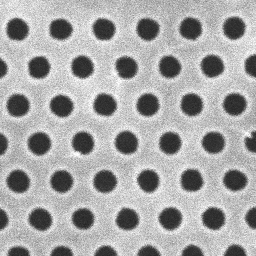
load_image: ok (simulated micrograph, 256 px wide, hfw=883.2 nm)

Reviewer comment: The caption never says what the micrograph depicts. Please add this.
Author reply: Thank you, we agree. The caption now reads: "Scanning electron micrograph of a regular array of holes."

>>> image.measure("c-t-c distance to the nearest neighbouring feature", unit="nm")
148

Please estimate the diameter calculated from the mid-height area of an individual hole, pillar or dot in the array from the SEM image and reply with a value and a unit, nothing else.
81.4 nanometers